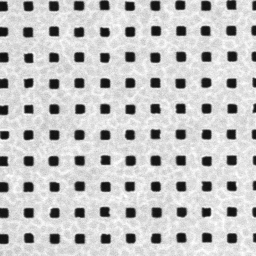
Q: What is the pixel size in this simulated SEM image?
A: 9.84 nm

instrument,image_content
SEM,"a regular array of holes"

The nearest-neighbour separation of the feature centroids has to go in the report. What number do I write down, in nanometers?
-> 246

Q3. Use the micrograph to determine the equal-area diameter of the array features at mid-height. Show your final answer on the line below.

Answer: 110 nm